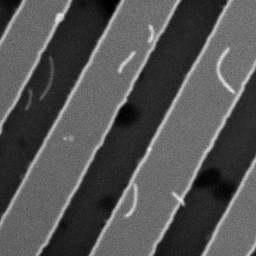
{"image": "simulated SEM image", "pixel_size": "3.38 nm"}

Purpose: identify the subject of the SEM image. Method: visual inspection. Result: lines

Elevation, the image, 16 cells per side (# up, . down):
.###...####...##
.###...###...###
###...####...###
###...###...####
##...####...####
#....###...####.
#...####...####.
...####...####..
...####...####..
..####...####...
..###....###....
.####...####...#
.###...####...##
####...####...##
###...####...###
###...####...###